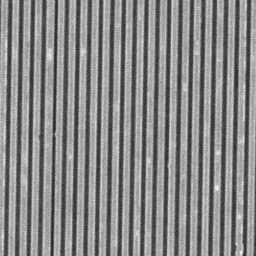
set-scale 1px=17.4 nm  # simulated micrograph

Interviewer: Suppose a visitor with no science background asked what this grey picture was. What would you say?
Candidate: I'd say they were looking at parallel lines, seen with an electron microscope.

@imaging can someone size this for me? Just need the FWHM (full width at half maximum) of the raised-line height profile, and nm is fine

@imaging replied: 111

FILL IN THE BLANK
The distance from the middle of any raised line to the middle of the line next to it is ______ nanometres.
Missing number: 197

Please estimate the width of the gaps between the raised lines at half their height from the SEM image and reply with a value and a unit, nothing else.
93.2 nanometers